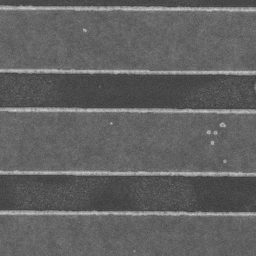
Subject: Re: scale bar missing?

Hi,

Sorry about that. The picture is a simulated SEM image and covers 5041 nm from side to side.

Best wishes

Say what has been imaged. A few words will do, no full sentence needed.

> lines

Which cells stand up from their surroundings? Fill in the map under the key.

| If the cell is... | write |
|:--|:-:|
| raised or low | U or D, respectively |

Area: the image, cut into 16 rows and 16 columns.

UUUUUUUUUUUDDDDD
UUUUUUUUUUUUUUUU
UUUUUUUUUUUUUUUU
UUUUUUUUUUUUUUUU
DDDDDDDDUUUUUUUU
DDDDDDDDDDDDDDDD
DDDDDDDDDDDDDDDD
UUUUUUUUUUUUUUUU
UUUUUUUUUUUUUUUU
UUUUUUUUUUUUUUUU
UUUUUUUUUUUUUUUU
DDDDDDDDDDDDDDDD
DDDDDDDDDDDDDDDD
UUUUUUUUUUUUUUUU
UUUUUUUUUUUUUUUU
UUUUUUUUUUUUUUUU